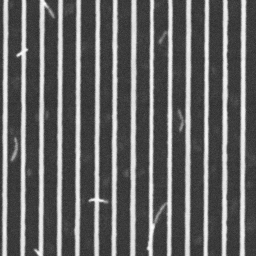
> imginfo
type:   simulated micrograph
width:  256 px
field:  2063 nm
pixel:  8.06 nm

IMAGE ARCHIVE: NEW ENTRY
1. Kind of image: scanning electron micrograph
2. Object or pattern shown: parallel lines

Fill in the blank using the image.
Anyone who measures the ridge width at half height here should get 0.0312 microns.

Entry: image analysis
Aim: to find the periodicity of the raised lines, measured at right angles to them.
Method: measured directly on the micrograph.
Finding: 147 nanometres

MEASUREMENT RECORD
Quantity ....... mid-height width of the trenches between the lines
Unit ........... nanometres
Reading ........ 116